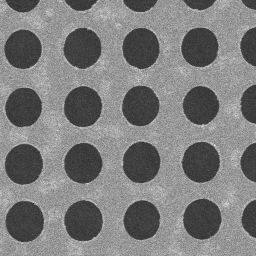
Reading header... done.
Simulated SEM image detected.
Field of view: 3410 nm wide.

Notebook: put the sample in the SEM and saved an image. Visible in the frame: a regular array of holes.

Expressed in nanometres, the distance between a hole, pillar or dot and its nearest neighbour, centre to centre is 758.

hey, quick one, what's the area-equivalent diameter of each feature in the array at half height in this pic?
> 524 nm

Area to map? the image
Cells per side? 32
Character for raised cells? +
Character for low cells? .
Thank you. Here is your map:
+....+++....++++...++++....+++..
+++++++++++++++++.++++++++++++++
++++++++++++++++++++++++++++++++
+++++++++++++++++.+++++++.++++++
+....+++....++++...++++....+++..
+....+++.....++.....+++....+++..
+....+++.....++.....+++....+++..
+....+++....++++....+++....++++.
++.+++++++.++++++.++++++++++++++
++++++++++++++++++++++++++++++++
++++++++++++++++++++++++++++++++
++..+++++...++++...+++++...++++.
+....+++.....++.....+++....+++..
+....+++.....++.....+++....+++..
+....+++.....+++....+++....+++..
++..+++++...++++...+++++..++++++
++++++++++++++++++++++++++++++++
++++++++++++++++++++++++++++++++
++..+++++...++++...++++....++++.
+....+++.....++.....+++....+++..
+....+++.....++.....+++....+++..
+....+++.....+++....+++....+++..
+....++++...++++...+++++..+++++.
++++++++++++++++++++++++++++++++
++++++++++++++++++++++++++++++++
++..+++++...+++++..+++++...++++.
+....+++.....+++....+++.....++..
+....+++.....++.....+++.....++..
+....+++.....+++....+++....+++..
+....++++...++++...+++++...++++.
++++++++++++++++++++++++++++++++
++++++++++++++++++++++++++++++++